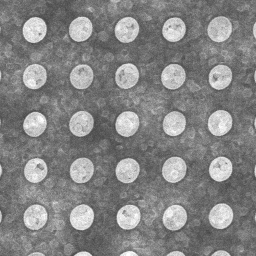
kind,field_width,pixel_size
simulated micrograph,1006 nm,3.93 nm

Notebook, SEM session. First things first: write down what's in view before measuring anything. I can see a regular array of raised bodies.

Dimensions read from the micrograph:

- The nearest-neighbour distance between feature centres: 180 nm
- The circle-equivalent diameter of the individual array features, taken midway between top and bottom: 89 nanometers